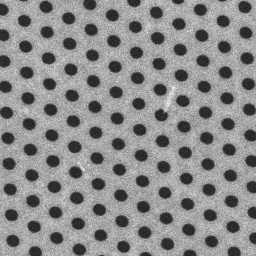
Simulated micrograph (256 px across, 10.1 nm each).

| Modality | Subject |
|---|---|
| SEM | a regular array of holes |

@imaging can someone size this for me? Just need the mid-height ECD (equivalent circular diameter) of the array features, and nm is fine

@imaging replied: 130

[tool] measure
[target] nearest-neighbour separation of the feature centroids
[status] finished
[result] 0.256 um